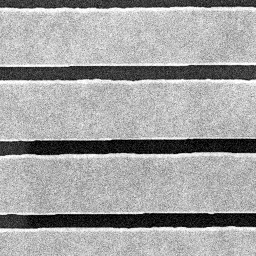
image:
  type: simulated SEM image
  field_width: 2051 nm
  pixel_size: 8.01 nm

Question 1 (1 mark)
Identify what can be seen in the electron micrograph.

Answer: lines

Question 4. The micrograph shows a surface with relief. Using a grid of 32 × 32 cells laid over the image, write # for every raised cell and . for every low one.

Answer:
................................
################################
################################
################################
################################
################################
################################
################################
................................
................................
################################
################################
################################
################################
################################
################################
################################
####............................
................................
.####..#########################
################################
################################
################################
################################
################################
################################
################################
................................
...........................####.
################################
################################
################################